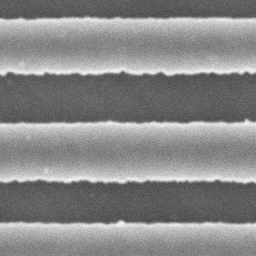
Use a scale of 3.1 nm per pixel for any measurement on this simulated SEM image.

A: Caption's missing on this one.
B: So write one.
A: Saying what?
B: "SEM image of lines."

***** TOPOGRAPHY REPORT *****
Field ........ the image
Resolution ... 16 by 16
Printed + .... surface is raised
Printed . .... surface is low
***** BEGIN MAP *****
................
++++++++++++++++
++++++++++++++++
++++++++++++++++
+++++++.++++++++
................
................
................
++++++++++++++++
++++++++++++++++
++++++++++++++++
................
................
................
++++++++++++++++
++++++++++++++++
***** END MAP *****